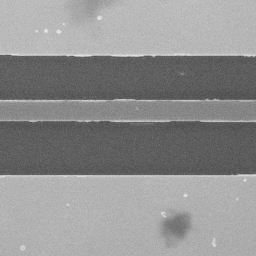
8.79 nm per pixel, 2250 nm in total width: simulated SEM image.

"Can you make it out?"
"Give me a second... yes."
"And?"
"lines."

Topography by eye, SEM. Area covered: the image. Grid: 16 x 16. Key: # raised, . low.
################
################
################
................
................
................
################
################
................
................
................
################
################
################
################
################